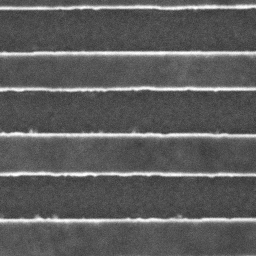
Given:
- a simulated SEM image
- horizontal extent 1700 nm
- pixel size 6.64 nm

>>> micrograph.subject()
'lines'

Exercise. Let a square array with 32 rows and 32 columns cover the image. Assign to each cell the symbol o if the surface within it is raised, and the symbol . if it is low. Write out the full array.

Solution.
oooooooooooooooooooooooooooooooo
................................
................................
................................
................................
................................
................................
oooooooooooooooooooooooooooooooo
oooooooooooooooooooooooooooooooo
oooooooooooooooooooooooooooooooo
oooooooooooooooooooooooooooooooo
................................
................................
................................
................................
................................
................................
oooooooooooooooooooooooooooooooo
oooooooooooooooooooooooooooooooo
oooooooooooooooooooooooooooooooo
oooooooooooooooooooooooooooooooo
oooooooooooooooooooooooooooooooo
................................
................................
................................
................................
................................
oooooooooooooooooooooooooooooooo
oooooooooooooooooooooooooooooooo
oooooooooooooooooooooooooooooooo
oooooooooooooooooooooooooooooooo
oooooooooooooooooooooooooooooooo